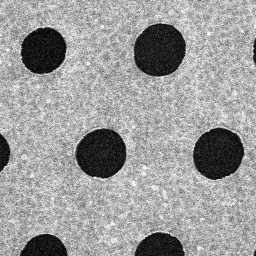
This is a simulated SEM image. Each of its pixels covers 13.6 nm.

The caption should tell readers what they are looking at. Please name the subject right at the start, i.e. holes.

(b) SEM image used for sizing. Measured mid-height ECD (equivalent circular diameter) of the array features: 690 nm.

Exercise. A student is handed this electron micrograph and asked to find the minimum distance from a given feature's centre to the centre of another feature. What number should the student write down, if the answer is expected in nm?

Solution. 1590